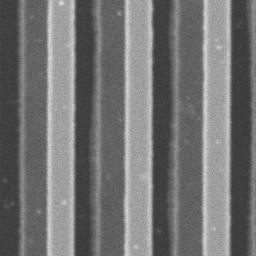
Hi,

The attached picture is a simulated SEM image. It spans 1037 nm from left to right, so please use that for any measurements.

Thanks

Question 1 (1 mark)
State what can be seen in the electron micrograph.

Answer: lines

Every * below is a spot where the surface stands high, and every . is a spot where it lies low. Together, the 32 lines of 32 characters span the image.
...******...*******...*******..*
...******...*******...*******..*
...******...*******...*******..*
...******...*******...*******..*
...******...*******...*******..*
...******...*******...*******...
...******...*******...*******...
...******...*******...*******...
...******...*******...*******...
...******...*******...*******...
...******...*******...*******...
...******...*******...*******...
...******...*******...*******...
...******...*******...*******...
...******...*******...*******...
...******...*******...*******...
...******...*******...*******...
...******...*******...*******...
...******...*******...*******...
...******...*******...*******...
...******...*******...*******...
...******...*******...*******...
...******...*******...*******...
...******...*******...*******...
...******...*******...*******..*
...******...*******...*******..*
...******...*******...*******..*
...******...*******...*******..*
...******...*******...*******..*
...******...*******...*******..*
...******...*******...*******...
...******...*******...*******...